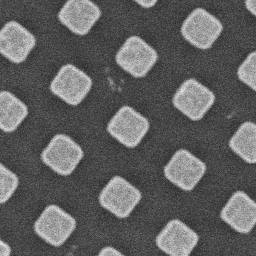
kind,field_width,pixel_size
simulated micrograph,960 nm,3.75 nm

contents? a regular array of raised bodies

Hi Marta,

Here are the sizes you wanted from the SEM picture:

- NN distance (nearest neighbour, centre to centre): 265 nanometers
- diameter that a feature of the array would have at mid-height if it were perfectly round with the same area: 36.3 px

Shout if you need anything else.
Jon